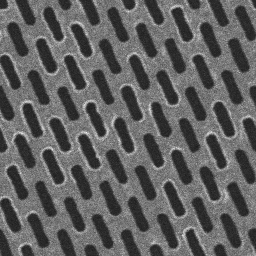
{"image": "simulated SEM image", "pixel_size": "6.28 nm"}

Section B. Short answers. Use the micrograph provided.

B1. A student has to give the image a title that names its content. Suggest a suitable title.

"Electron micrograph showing a regular array of holes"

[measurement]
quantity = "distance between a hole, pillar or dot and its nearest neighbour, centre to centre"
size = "32.1 px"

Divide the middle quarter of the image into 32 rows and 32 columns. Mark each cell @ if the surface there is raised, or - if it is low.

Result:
@--@@@@@@@@---@@@---@@@@@@@---@@
@---@@@@-@@---@@@---@@@@-@@@--@@
@----@@---@@-@@@@@---@@---@@@@@@
@@---@@---@@@@@@@@---@@---@@@@@@
@@---@@@---@@@@@@@----@----@@@@@
@@@---@@---@@@@--@@---@@---@@@@@
-@@-@@@@@---@@---@@@-@@@@---@@--
-@@@@@@@@---@@----@@@@@@@---@@--
--@@@@@@@---@@@---@@@@@@@----@@-
--@@@@@@@@---@@---@@@@@@@@---@@-
---@@---@@@@@@@@---@@@--@@@@@@@@
---@@---@@@@@@@@---@@@---@@@@@@@
@---@@---@@@@@@@@---@@---@@@@@@@
@---@@---@@@@-@@@---@@----@@@@@@
@@@@@@@---@@@--@@@@@@@@---@@@--@
@@@@@@@---@@----@@@@@@@@---@@---
@@@@@@@@---@@---@@@@@@@@---@@---
-@@@@@@@--@@@---@@@@--@@---@@---
-@@---@@@@@@@@---@@@---@@@@@@@--
-@@@---@@@@@@@---@@@---@@@@@@@--
--@@---@@@@@@@----@@----@@@@@@@-
-@@@@---@@@--@@---@@@---@@@--@@-
@@@@@---@@---@@@@@@@@---@@@---@@
@@@@@@--@@@---@@@@@@@----@@---@@
@@@@@@---@@---@@@@@@@@---@@---@@
@@--@@---@@@---@@@--@@@--@@@---@
@@---@@@@@@@---@@@---@@@@@@@----
@@---@@@@@@@----@@---@@@@@@@----
@@@---@@@@@@@---@@---@@@@@@@@---
@@@---@@@--@@@--@@@---@@@--@@---
@@@----@@---@@@@@@@---@@@--@@@@@
@@@@---@@---@@@@@@@----@@---@@@@